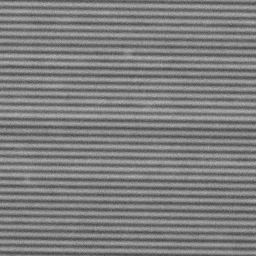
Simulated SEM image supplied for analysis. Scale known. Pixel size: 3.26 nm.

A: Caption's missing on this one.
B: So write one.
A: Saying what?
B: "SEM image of parallel lines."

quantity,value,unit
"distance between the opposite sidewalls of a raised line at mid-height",0.0139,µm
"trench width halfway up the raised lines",0.0086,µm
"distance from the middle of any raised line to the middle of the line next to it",0.0243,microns